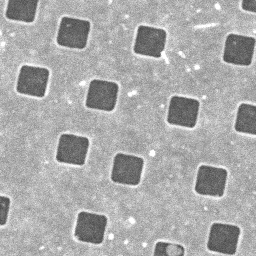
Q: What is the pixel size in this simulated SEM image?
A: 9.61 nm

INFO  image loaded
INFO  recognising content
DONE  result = a regular array of holes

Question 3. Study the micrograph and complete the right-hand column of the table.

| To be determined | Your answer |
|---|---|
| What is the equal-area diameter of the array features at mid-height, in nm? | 322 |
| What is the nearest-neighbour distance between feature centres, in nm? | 605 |